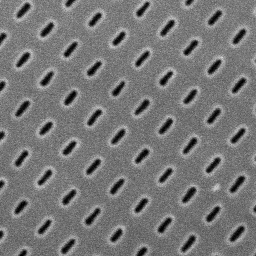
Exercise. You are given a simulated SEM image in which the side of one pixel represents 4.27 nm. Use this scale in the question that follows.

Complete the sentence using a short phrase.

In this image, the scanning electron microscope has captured a regular array of holes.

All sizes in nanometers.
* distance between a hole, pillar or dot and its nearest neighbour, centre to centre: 130